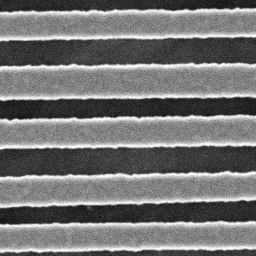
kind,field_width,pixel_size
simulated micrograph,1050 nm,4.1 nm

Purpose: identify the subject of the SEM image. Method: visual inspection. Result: lines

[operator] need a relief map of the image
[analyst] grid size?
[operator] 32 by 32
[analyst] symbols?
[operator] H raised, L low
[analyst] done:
LLLLLLLLLLLLLLLLLLLLLLLLLLLLLLLL
HHHHHHHHHHHHHHHHHHHHHHHHHHHHHHHH
HHHHHHHHHHHHHHHHHHHHHHHHHHHHHHHH
HHHHHHHHHHHHHHHHHHHHHHHHHHHHHHHH
HHHHHHHHHHHHHHHHHHHHHHHHHHHHHHHH
LLLLLLLLLLLLLLLLLLLLLLLLLLLLLLLL
LLLLLLLLLLLLLLLLLLLLLLLLLLLLLLLL
LLLLLLLLLLLLLLLLLLLLLLLLLLLLLLLL
HHHHHHHHHHHHHHHHHHHHHHHHHHHHHHHH
HHHHHHHHHHHHHHHHHHHHHHHHHHHHHHHH
HHHHHHHHHHHHHHHHHHHHHHHHHHHHHHHH
HHHHHHHHHHHHHHHHHHHHHHHHHHHHHHHH
HLLLLLLLLLLLLLLLLLLLLLLLLLLLLLLL
LLLLLLLLLLLLLLLLLLLLLLLLLLLLLLLL
LLLLLLLLLLLLLLLLLLLLLLLLLLLHLHHL
HHHHHHHHHHHHHHHHHHHHHHHHHHHHHHHH
HHHHHHHHHHHHHHHHHHHHHHHHHHHHHHHH
HHHHHHHHHHHHHHHHHHHHHHHHHHHHHHHH
HLLLLLLLLLLLLLLLLLLLLLLLLLLLLLLL
LLLLLLLLLLLLLLLLLLLLLLLLLLLLLLLL
LLLLLLLLLLLLLLLLLLLLLLLLLLLLLLLL
LLLLLLLLLLLLLLLLLLLLLLLLLLLLHLLH
HHHHHHHHHHHHHHHHHHHHHHHHHHHHHHHH
HHHHHHHHHHHHHHHHHHHHHHHHHHHHHHHH
HHHHHHHHHHHHHHHHHHHHHHHHHHHHHHHH
HHHHHHHHHHHHHHHLLHLLLLLLLLLLLLLL
LLLLLLLLLLLLLLLLLLLLLLLLLLLLLLLL
LLLLLLLLLLLLLLLLLLLLLLLLLLLLLLLL
HHHHHHHHHHHHHHHHHHHHHHHHHHHHHHHH
HHHHHHHHHHHHHHHHHHHHHHHHHHHHHHHH
HHHHHHHHHHHHHHHHHHHHHHHHHHHHHHHH
HHHLHHLLLLLLLLLLLLLLLLLLLLLLLLLL